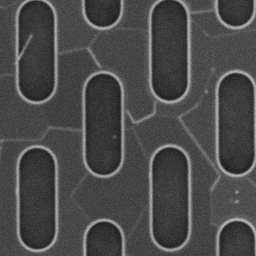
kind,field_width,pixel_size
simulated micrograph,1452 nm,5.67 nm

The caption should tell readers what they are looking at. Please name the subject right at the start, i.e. groups of lines, slits or small figures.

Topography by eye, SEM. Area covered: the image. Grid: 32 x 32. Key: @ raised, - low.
@@@---@@@@-----@@@@@---@@@@-----
@@-----@@@@----@@@@----@@@@-----
@@-----@@@@----@@@@-----@@@@---@
@@-----@@@@@@@@@@@@-----@@@@@@@@
@@-----@@@@@@@@@@@@-----@@@@@@@@
@@-----@@@@@@@@@@@@-----@@@@@@@@
@@-----@@@@@@@@@@@@-----@@@@@@@@
@@-----@@@@@@@@@@@@-----@@@@@@@@
@@-----@@@@@@@@@@@@-----@@@@@@@@
@@-----@@@@@--@@@@@-----@@@@---@
@@-----@@@@----@@@@-----@@@-----
@@-----@@@@----@@@@----@@@@-----
@@@---@@@@@----@@@@@--@@@@@-----
@@@@@@@@@@@----@@@@@@@@@@@@-----
@@@@@@@@@@@----@@@@@@@@@@@@-----
@@@@@@@@@@@----@@@@@@@@@@@@-----
@@@@@@@@@@@----@@@@@@@@@@@@-----
@@@@@@@@@@@----@@@@@@@@@@@@-----
@@@@-@@@@@@----@@@@@--@@@@@-----
@@@----@@@@----@@@@----@@@@-----
@@-----@@@@----@@@@-----@@@-----
@@-----@@@@@--@@@@@-----@@@@---@
@@-----@@@@@@@@@@@@-----@@@@@@@@
@@-----@@@@@@@@@@@@-----@@@@@@@@
@@-----@@@@@@@@@@@@-----@@@@@@@@
@@-----@@@@@@@@@@@@-----@@@@@@@@
@@-----@@@@@@@@@@@@-----@@@@@@@@
@@-----@@@@@@@@@@@@-----@@@@@-@@
@@-----@@@@----@@@@-----@@@@----
@@-----@@@@----@@@@-----@@@-----
@@@---@@@@@----@@@@@---@@@@-----
@@@@@@@@@@@----@@@@@@@@@@@@-----